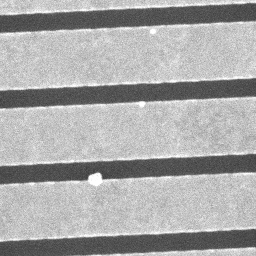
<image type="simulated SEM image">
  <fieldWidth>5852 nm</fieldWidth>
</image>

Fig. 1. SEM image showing lines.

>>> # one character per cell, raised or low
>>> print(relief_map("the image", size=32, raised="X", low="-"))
XXXXXXXXXXXXXXXXXXXXXXXXXXXXX---
XXXXXXX-------------------------
--------------------------------
--------------XXXXXXXXXXXXXXXXXX
XXXXXXXXXXXXXXXXXXXXXXXXXXXXXXXX
XXXXXXXXXXXXXXXXXXXXXXXXXXXXXXXX
XXXXXXXXXXXXXXXXXXXXXXXXXXXXXXXX
XXXXXXXXXXXXXXXXXXXXXXXXXXXXXXXX
XXXXXXXXXXXXXXXXXXXXXXXXXXXXXXXX
XXXXXXXXXXXXXXXXXXXXXXXXXXXXXXXX
XXXXXXXXXXXXXXX-----------------
--------------------------------
-------------------------XXXXXXX
----XXXXXXXXXXXXXXXXXXXXXXXXXXXX
XXXXXXXXXXXXXXXXXXXXXXXXXXXXXXXX
XXXXXXXXXXXXXXXXXXXXXXXXXXXXXXXX
XXXXXXXXXXXXXXXXXXXXXXXXXXXXXXXX
XXXXXXXXXXXXXXXXXXXXXXXXXXXXXXXX
XXXXXXXXXXXXXXXXXXXXXXXXXXXXXXXX
XXXXXXXXXXXXXXXXXXXXXXXXX-------
XXXXX---------------------------
--------------------------------
-----------XXXXXXXXXXXXXXXXXXXXX
XXXXXXXXXXXXXXXXXXXXXXXXXXXXXXXX
XXXXXXXXXXXXXXXXXXXXXXXXXXXXXXXX
XXXXXXXXXXXXXXXXXXXXXXXXXXXXXXXX
XXXXXXXXXXXXXXXXXXXXXXXXXXXXXXXX
XXXXXXXXXXXXXXXXXXXXXXXXXXXXXXXX
XXXXXXXXXXXXXXXXXXXXXXXXXXXXXXXX
XXXXXXXXXXXX--------------------
--------------------------------
--------------------XXXXXXXXXXXX